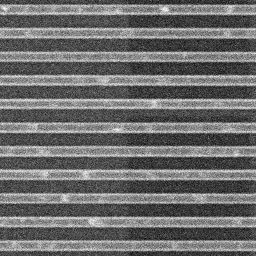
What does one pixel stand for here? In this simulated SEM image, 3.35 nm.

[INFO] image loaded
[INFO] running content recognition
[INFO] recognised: parallel lines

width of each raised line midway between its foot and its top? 0.0305 um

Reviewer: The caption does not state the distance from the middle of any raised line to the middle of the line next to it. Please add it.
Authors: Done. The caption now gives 0.0789 micrometres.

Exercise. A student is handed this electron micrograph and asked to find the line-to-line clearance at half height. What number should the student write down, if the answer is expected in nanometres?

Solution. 46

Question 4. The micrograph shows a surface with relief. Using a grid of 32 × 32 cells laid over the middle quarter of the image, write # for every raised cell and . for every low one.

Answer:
................................
................................
................................
################################
################################
................................
................................
................................
................................
################################
################################
................................
................................
................................
................................
################################
################################
................................
................................
................................
................................
################################
################################
................................
................................
................................
................................
################################
################################
................................
................................
................................